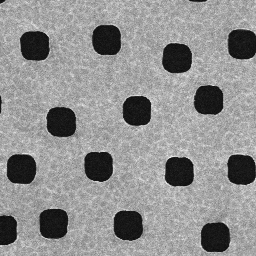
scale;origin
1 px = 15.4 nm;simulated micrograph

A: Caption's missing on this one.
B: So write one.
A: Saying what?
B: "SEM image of a regular array of holes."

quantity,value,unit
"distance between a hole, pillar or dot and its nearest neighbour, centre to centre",0.995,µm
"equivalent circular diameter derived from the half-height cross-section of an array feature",475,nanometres